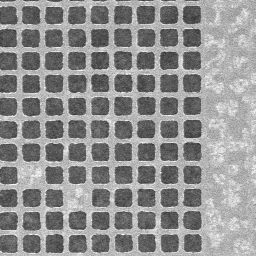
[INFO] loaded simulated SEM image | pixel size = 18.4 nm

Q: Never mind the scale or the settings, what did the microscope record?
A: a regular array of holes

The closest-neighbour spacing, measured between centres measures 416 nm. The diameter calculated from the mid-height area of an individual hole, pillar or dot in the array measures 374 nanometers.